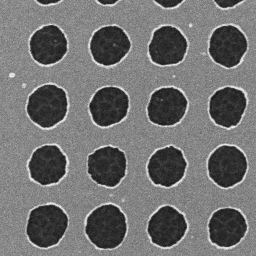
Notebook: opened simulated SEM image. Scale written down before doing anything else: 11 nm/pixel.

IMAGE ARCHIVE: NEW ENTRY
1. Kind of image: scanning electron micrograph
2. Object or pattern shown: a regular array of holes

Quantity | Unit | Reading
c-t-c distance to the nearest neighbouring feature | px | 59.4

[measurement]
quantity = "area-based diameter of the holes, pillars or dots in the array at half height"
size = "442 nanometers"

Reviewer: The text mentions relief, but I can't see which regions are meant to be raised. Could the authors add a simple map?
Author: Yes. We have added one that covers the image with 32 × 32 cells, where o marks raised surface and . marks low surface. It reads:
ooooo..oooooo.oooooo..ooooo...oo
oooooooooooooooooooooooooooooooo
oooooooooooooooooooooooooooooooo
ooooo..oooooo..ooooo..ooooo...oo
oooo....oooo....ooo....ooo.....o
oooo....ooo.....ooo....ooo.....o
oooo....ooo.....ooo....ooo.....o
oooo....oooo...oooo....oooo...oo
oooooooooooooooooooooooooooo.ooo
oooooooooooooooooooooooooooooooo
oooooooooooooooooooooooooooooooo
oooo....oooo....ooo....oooo...oo
oooo....ooo.....ooo....ooo.....o
ooo.....ooo.....oo.....ooo.....o
oooo....ooo.....oo.....ooo....oo
oooo...ooooo..oooooo..ooooo...oo
oooooooooooooooooooooooooooooooo
oooooooooooooooooooooooooooooooo
ooooo..ooooo...ooooo..ooooo...oo
oooo....ooo.....ooo....ooo.....o
oooo....ooo.....oo.....ooo.....o
oooo....ooo.....oo.....ooo.....o
oooo....oooo...oooo....oooo...oo
oooooooooooooooooooooooooooooooo
oooooooooooooooooooooooooooooooo
oooooooooooooooooooooooooooooooo
oooo....ooo....oooo....oooo...oo
ooo......oo.....ooo....ooo.....o
ooo.....ooo.....oo.....ooo.....o
ooo.....ooo.....ooo....ooo.....o
oooo...ooooo...oooo...ooooo...oo
oooooooooooooooooooooooooooooooo